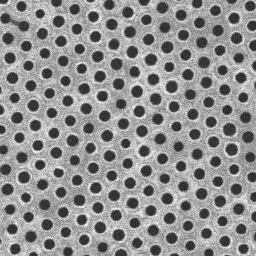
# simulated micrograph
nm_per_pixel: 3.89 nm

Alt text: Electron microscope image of a regular array of holes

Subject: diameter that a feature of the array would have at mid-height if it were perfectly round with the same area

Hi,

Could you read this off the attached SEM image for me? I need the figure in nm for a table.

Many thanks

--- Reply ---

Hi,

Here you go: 43.5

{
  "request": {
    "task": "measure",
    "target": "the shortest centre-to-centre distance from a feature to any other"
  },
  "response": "77.2 nm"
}